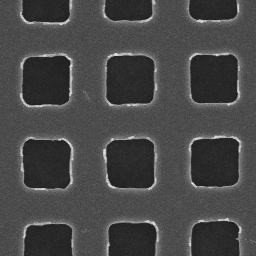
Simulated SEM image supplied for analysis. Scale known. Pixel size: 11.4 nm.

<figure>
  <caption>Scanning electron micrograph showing holes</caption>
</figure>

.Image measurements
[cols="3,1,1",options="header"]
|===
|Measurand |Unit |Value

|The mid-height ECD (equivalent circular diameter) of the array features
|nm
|602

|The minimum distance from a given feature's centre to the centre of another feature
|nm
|948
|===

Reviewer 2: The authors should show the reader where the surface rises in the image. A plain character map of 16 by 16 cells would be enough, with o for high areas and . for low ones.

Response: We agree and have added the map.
o...ooo...oo...o
oooooooooooooooo
oooooooooooooooo
ooooooo..ooo..oo
o...ooo...oo...o
o...ooo...oo...o
oo..ooo..ooooooo
oooooooooooooooo
oooooooooooooooo
o...ooo...oo...o
o...ooo...oo...o
oo..ooo..ooo...o
oooooooooooooooo
oooooooooooooooo
oo..ooo...oo...o
oo..ooo...oo...o